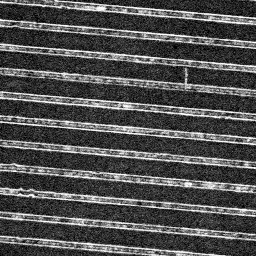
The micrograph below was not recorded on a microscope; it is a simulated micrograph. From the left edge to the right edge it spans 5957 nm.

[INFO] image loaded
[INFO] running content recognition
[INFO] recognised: parallel lines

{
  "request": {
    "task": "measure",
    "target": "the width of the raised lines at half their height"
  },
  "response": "139 nanometers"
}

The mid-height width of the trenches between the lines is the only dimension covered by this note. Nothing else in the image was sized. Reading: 0.42 µm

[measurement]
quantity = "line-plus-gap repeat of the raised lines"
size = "556 nm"